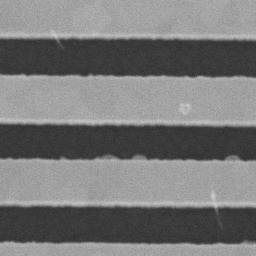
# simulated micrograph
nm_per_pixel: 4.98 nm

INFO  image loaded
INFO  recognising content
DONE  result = lines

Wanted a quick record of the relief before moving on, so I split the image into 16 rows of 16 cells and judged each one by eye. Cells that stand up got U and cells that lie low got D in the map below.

UUUUUUUUUUUUUUUU
UUUUUUUUUUUUUUUU
DDDDDDDDDDDDDDDD
DDDDDDDDDDDDDDDD
DDDDDDDDDDDDDDDD
UUUUUUUUUUUUUUUU
UUUUUUUUUUUUUUUU
UUUUUUUUUUUUUUUU
DDDDDDDDDDDDDDDD
DDDDDDDDDDDDDDDD
UUUUUUUUUUUUUUUU
UUUUUUUUUUUUUUUU
UUUUUUUUUUUUUUUU
DDDDDDDDDDDDDDDD
DDDDDDDDDDDDDDDD
UUUUUUUUUUUUUUUU